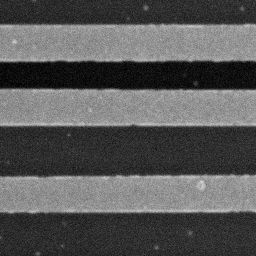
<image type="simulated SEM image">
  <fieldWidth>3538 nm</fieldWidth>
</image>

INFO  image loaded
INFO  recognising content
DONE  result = lines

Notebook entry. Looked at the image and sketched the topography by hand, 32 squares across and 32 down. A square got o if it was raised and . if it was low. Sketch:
................................
................................
................................
oooooooooooooooooooooooooooooooo
oooooooooooooooooooooooooooooooo
oooooooooooooooooooooooooooooooo
oooooooooooooooooooooooooooooooo
ooooooo.ooo.ooooooooo..o..ooo.oo
................................
................................
................................
oooooooooooooooooooooooooooooooo
oooooooooooooooooooooooooooooooo
oooooooooooooooooooooooooooooooo
oooooooooooooooooooooooooooooooo
oooooooooooooooooooooooooooooooo
................................
................................
................................
................................
................................
................................
oooooooooooooooooooooooooooooooo
oooooooooooooooooooooooooooooooo
oooooooooooooooooooooooooooooooo
oooooooooooooooooooooooooooooooo
.o.ooo..........................
................................
................................
................................
................................
................................